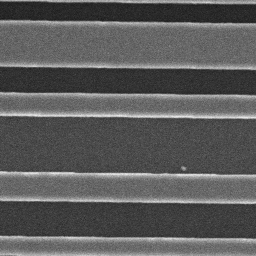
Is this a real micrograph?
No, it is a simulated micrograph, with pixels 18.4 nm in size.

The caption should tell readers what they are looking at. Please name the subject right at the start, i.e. lines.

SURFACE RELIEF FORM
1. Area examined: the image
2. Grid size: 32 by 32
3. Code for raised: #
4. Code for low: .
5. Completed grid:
................................
................................
................................
################################
################################
################################
################################
################################
.....................#..########
................................
................................
................................
################################
################################
............####################
................................
................................
................................
................................
................................
................................
................................
################################
################################
################################
................................
................................
................................
................................
................................
################################
################################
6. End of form